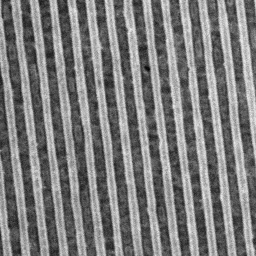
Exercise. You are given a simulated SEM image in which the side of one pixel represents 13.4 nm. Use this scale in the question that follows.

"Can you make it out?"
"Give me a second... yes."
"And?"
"parallel lines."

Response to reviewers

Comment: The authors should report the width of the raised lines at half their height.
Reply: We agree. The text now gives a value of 76.3 nanometres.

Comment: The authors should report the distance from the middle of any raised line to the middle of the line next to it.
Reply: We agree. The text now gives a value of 248 nanometres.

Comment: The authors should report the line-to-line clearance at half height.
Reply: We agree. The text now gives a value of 12.3 px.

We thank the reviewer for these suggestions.